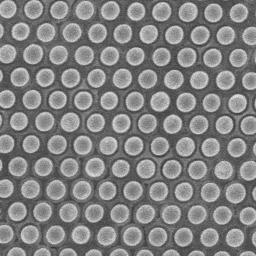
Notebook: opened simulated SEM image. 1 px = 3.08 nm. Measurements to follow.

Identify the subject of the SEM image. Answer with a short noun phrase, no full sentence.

a regular array of raised bodies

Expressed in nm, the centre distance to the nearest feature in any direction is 78.3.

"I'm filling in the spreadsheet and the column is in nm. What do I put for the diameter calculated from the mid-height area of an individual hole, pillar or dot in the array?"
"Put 56.5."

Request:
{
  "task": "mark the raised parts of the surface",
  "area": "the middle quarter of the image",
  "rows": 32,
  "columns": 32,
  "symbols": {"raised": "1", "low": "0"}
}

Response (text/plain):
00000000000000000000000000000110
01100001100000110000000000000000
11110011110001111001111000111000
11110011110011111001111001111100
11110011110011111001111001111100
11100001100001110001110000111000
00000000000000000000000000000000
00011100001110000110000110000011
10011110011110001111001111001111
00011110011110001111001111001111
00011100001110001110001111001111
00000000000000000110000110000111
01100000100000000000000000000000
11110011110001110001111000111000
11110011110011110001111001111000
11110011110011110001111001111000
11100011100001110001110001111000
00000000000000000000000000000000
00011100001100000100000110000010
10011110011110001110001111001111
10011110011110011111001111001111
00011110011110011110001111001111
00000000001100001100000110000111
00000000000000000000000000000000
11100011110001110001110000111000
11100011110011110011111001111001
11100011110011110011111001111001
11100011100001110011110001111001
00000000000000000000000000110000
00001000000000000000000000000000
00011110011110011110001110001111
00111110011110011110011111001111